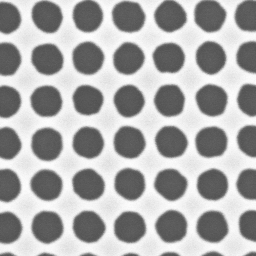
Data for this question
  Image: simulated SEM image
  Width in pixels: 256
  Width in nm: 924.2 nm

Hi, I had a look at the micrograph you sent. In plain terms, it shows a regular array of holes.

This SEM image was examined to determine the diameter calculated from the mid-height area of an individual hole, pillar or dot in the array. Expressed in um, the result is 0.117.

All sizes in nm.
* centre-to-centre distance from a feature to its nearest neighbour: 147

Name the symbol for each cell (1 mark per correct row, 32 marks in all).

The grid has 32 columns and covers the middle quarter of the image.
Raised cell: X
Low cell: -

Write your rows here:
XX--------XX--------XXX-------XX
XXX------XXXX------XXXX------XXX
XXXXX---XXXXXX---XXXXXXXXXXXXXXX
XXXXXXXXXXXXXXXXXXXXXXXXXXXXXXXX
XXXXXXXXXXXXXXXXXXXXXXXXXXXXXXXX
XXXX---XXXXXXXX---XXXXXX----XXXX
XXX------XXXX------XXXX------XXX
XX--------XXX-------XXX-------XX
XX--------XX--------XXX-------XX
XX--------XX--------XX--------XX
XX-------XXXX-------XXX-------XX
XXX------XXXX------XXXX-------XX
XXXX----XXXXXX-----XXXXX-----XXX
XXXXXXXXXXXXXXXXXXXXXXXXXXXXXXXX
XXXXXXXXXXXXXXXXXXXXXXXXXXXXXXXX
XXXXXXXXXXXXXXX--XXXXXXXX---XXXX
XXXX-----XXXX------XXXXX-----XXX
XXX------XXXX-------XXX-------XX
XX--------XX--------XXX--------X
XX--------XX--------XXX--------X
XX--------XX--------XXX--------X
XX--------XXX-------XXX-------XX
XXX------XXXX------XXXXX------XX
XXXXX--XXXXXXXX---XXXXXXXXXXXXXX
XXXXXXXXXXXXXXXXXXXXXXXXXXXXXXXX
XXXXXXXXXXXXXXXXXXXXXXXXXXXXXXXX
XXXX----XXXXXX----XXXXXXX---XXXX
XXX------XXXX-------XXX------XXX
XX--------XXX-------XXX-------XX
XX--------XX--------XX---------X
XX--------XX--------XX---------X
XX--------XXX-------XXX--------X